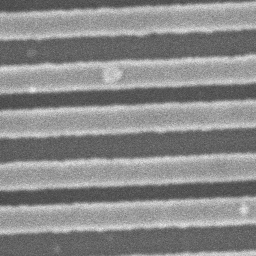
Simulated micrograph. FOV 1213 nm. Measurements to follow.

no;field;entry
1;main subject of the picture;lines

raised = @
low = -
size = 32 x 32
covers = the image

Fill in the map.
------------------------@@@@@@@@
----@@@@@@@@@@@@@@@@@@@@@@@@@@@@
@@@@@@@@@@@@@@@@@@@@@@@@@@@@@@@@
@@@@@@@@@@@@@@@@@@@@@@@@@@@@@@@@
@@@@@@@@@@----------------------
--------------------------------
--------------------------------
---------------------@@@@@@@@@@@
@@@@@@@@@@@@@@@@@@@@@@@@@@@@@@@@
@@@@@@@@@@@@@@@@@@@@@@@@@@@@@@@@
@@@@@@@@@@@@@@@@@@@@@@@@@@@@----
@@@@@---------------------------
-------------------------------@
------@@@@@@@@@@@@@@@@@@@@@@@@@@
@@@@@@@@@@@@@@@@@@@@@@@@@@@@@@@@
@@@@@@@@@@@@@@@@@@@@@@@@@@@@@@@@
@@@@@@@@@@@@@@@@@@--------------
--------------------------------
--------------------------------
-----------------------@@@@@@@@@
-@@@@@@@@@@@@@@@@@@@@@@@@@@@@@@@
@@@@@@@@@@@@@@@@@@@@@@@@@@@@@@@@
@@@@@@@@@@@@@@@@@@@@@@@@@@@@@@@-
@@@@@@@-------------------------
--------------------------------
---------@@@@@@@@@@@@@@@@@@@@@@@
@@@@@@@@@@@@@@@@@@@@@@@@@@@@@@@@
@@@@@@@@@@@@@@@@@@@@@@@@@@@@@@@@
@@@@@@@@@@@@@@@@@-@-------------
--------------------------------
--------------------------------
------------------------------@@